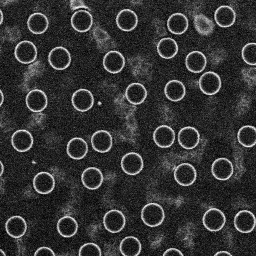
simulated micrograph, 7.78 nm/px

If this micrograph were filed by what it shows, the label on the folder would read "a regular array of raised bodies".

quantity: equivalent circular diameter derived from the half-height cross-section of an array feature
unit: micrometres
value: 0.166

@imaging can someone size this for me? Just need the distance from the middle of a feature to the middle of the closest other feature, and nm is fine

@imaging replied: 272